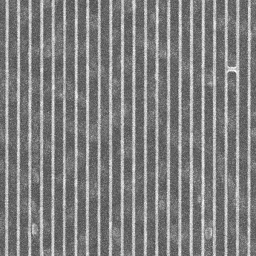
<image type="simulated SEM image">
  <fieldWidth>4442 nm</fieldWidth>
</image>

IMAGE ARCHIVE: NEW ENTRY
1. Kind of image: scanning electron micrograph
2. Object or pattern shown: parallel lines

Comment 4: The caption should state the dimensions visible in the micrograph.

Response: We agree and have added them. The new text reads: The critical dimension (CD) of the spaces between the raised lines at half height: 160 nanometres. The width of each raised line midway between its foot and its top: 36.9 nanometers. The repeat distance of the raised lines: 200 nanometres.